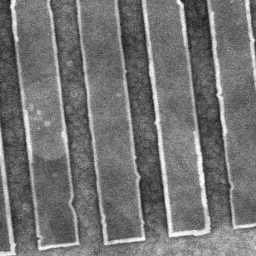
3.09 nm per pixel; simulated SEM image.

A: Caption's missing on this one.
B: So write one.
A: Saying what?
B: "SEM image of one or a few lines or trenches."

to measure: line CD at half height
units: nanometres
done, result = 121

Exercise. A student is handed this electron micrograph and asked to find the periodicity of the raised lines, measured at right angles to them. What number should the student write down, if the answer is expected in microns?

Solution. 0.202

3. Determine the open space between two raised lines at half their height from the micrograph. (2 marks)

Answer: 80.6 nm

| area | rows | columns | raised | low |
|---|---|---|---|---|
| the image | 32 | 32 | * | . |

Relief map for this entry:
.*****....*****...*****...*****.
.*****....*****...*****...*****.
..*****...*****...*****...*****.
..*****...*****...*****...*****.
..*****...*****...*****....*****
..*****...*****...*****....*****
..*****...*****....****....*****
..*****...*****....*****...*****
..*****....*****...*****...*****
..*****....*****...*****...*****
...****....*****...*****...*****
...*****...*****...*****...*****
...*****...*****...*****...*****
...*****...*****...*****....****
...*****...*****...*****....****
...*****...*****....*****...****
...*****....*****...*****...****
...*****....*****...*****...****
...*****....*****...*****...****
....*****...*****...*****...****
....*****...*****...*****...****
*...*****...*****...*****....***
*...*****...*****...******...***
*...*****...*****....*****...***
*...*****...*****....*****...***
*...*****....*****...*****...***
*...*****....*****...*****...***
*....****....*****...*****...***
*....*****...*****...*****......
*....*****...*****...*..........
**...****.......................
**..............................